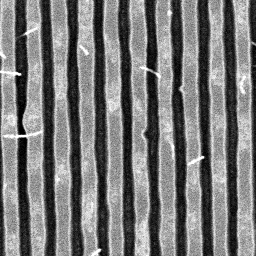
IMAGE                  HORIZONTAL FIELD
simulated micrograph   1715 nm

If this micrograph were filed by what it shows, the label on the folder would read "parallel lines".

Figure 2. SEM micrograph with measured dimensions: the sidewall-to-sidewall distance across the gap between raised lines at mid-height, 72.8 nm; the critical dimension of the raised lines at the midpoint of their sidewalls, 106 nm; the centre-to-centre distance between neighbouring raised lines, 175 nm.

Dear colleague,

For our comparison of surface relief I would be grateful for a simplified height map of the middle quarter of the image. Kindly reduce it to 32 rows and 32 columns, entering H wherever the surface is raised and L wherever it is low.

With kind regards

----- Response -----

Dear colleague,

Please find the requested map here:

HLLLHHHHLLLHHHLLLHHHLLLHHHHLLLHH
HLLLHHHHLLLHHHLLLHHHHLLHHHHLLHHH
HLLLHHHHLLHHHHLLLHHHHLLHHHHLLHHH
HLLLHHHLLLHHHHLLLHHHHLLHHHHLLHHH
HLLLHHHLLLHHHHLLLHHHHLLHHHHLLLHH
HLLLHHHLLLHHHHLLLHHHHLLHHHHLLHHH
HLLLHHHLLLHHHHLLLHHHHLLLHHHLLHHH
LLLLHHHLLLHHHHLLLHHHHLLLHHHLLLHH
HLLLHHHLLLHHHHLLLHHHHLLLHHHLLLHH
HLLLHHHLLLHHHHLLLHHHHLLLHHHLLLHH
HLLLHHHLLLLHHHLLLHHHHLLLHHHLLLHH
HLLLHHHHLLLHHHLLLHHHHLLLHHHLLLHH
HLLLHHHHLLLHHHLLLHHHHLLLHHHLLLHH
HLLLHHHHLLLHHHHLLHHHLLLLHHHLLLHH
HLLLHHHHLLLHHHHLLHHHHLLLHHHLLLHH
HLLLHHHHLLLHHHHLLHHHHLLLHHHLLLHH
HLLLHHHHLLLHHHHLLHHHHLLLHHHLLLHH
HLLLHHHHLLLHHHHLLHHHLLLLHHHLLLHH
HLLLHHHHLLLHHHHLLHHHLLLLHHHLLLLH
HLLLHHHHLLLHHHHLLHHHHLLLHHHLLLLH
HLLLHHHLLLLHHHHLLHHHHLLLHHHLLLLH
HLLLHHHLLLLHHHHLLHHHHLLLHHHHLLLH
HLLLHHHLLLLHHHHLLHHHHLLLHHHHLLLH
HHLLHHHHLLLHHHHLLHHHHLLLHHHHLLLH
HHLLLHHHLLLHHHHLLHHHHLLLHHHHLLLH
HHLLLHHHLLLHHHHLLHHHHLLLHHHHLLLH
HHLLHHHHLLLHHHHLLHHHHLLLHHHHLLLH
HHLLHHHHLLLHHHHLLHHHHLLLHHHHLLLH
HHLLLHHHLLLHHHHLLHHHHLLLHHHHLLLH
HHLLLHHHLLLHHHHLLLHHHLLLHHHHLLLH
HHLLLHHHLLLHHHHLLLHHHLLLHHHHLLLH
HHLLHHHHLLLHHHHLLLHHHLLLHHHHLLHH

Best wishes